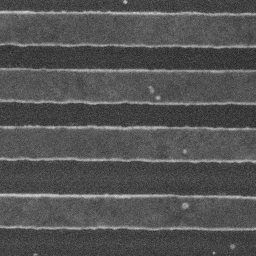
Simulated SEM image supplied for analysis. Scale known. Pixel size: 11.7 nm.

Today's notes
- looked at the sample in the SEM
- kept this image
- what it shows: lines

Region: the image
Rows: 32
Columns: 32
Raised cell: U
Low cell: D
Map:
DDDDDDDDDDDDDDDDDDDDDDDDDDDDDDDD
DDDDDDDDDDDDDDDDDDDDDDDDDDDDDDDD
UUUUUUUUUUUUUUUUUUUUUUUUUUUUUUUU
UUUUUUUUUUUUUUUUUUUUUUUUUUUUUUUU
UUUUUUUUUUUUUUUUUUUUUUUUUUUUUUUU
UUUUUUUUUUUUUUUUUUUUUUUUUUUUUUUU
DDDDDDDDDDDDDDDDDDDDDDDDDDDDDDDD
DDDDDDDDDDDDDDDDDDDDDDDDDDDDDDDD
DDDDDDDDDDDDDDDDDDDDDDDDDDDDDDDD
UUUUUUUUUUUUUUUUUUUUUUUUUUUUUUUU
UUUUUUUUUUUUUUUUUUUUUUUUUUUUUUUU
UUUUUUUUUUUUUUUUUUUUUUUUUUUUUUUU
UUUUUUUUUUUUUUUUUUUUUUUUUUUUUUUU
DDDDDDDDDDDDDDDDDDDDDDDDDDDDDDDD
DDDDDDDDDDDDDDDDDDDDDDDDDDDDDDDD
DDDDDDDDDDDDDDDDDDDDDDDDDDDDDDDD
UUUUUUUUUUUUUUUUUUUUUUUUUUUUUUUU
UUUUUUUUUUUUUUUUUUUUUUUUUUUUUUUU
UUUUUUUUUUUUUUUUUUUUUUUUUUUUUUUU
UUUUUUUUUUUUUUUUUUUUUUUUUUUUUUUU
DDDDDDDDDDDDDDDDDDDDDDDDDDDDDDDD
DDDDDDDDDDDDDDDDDDDDDDDDDDDDDDDD
DDDDDDDDDDDDDDDDDDDDDDDDDDDDDDDD
DDDDDDDDDDDDDDDDDDDDDDDDDDDDDDDD
UUUUUUUDDDDDDDDDDDDDDDDDDDDDDDDD
UUUUUUUUUUUUUUUUUUUUUUUUUUUUUUUU
UUUUUUUUUUUUUUUUUUUUUUUUUUUUUUUU
UUUUUUUUUUUUUUUUUUUUUUUUUUUUUUUU
DDDDUUUUUUUUDDUDUUUUUUUUUUUUUUUU
DDDDDDDDDDDDDDDDDDDDDDDDDDDDDDDD
DDDDDDDDDDDDDDDDDDDDDDDDDDDDDDDD
DDDDDDDDDDDDDDDDDDDDDDDDDDDDDDDD